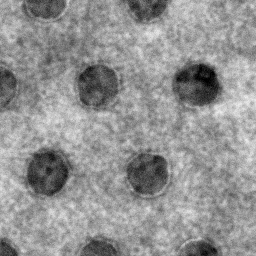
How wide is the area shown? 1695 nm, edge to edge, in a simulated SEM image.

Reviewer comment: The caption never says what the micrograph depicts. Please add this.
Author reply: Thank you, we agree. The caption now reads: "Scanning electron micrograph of raised bodies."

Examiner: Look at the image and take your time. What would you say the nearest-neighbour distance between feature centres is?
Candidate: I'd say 664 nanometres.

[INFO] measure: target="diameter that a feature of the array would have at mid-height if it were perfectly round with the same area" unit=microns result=0.299